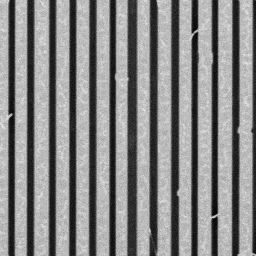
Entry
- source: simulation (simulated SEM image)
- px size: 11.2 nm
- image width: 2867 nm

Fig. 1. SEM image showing parallel lines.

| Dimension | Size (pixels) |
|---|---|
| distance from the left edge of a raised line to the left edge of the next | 20.4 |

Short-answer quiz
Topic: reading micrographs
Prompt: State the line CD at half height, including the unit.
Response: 146 nanometers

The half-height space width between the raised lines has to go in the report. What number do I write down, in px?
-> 6.88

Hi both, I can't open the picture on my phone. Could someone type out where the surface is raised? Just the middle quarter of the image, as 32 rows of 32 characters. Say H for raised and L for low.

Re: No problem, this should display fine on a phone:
HLLHHHLLHHHLLHHHLLHHHLLLHHHLLHHH
HLLHHHLLHHHLLHHHLLHHHLLLHHHLLHHH
HLLHHHLLHHHLLHHHLLHHHLLLHHHLLHHH
HLLHHHLLHHHLLHHHLLHHHLLLHHHLLHHH
HLLHHHLLHHHLLHHHLLHHHLLLHHHLLHHH
HLLHHHLLHHHLLHHHLLHHHLLLHHHLLHHH
HLLHHHLLHHHLLHHHLLHHHLLLHHHLLHHH
HLLHHHLLHHHLLHHHLLHHHLLLHHHLLHHH
HLLHHHLLHHHLLHHHLLHHHLLLHHHLLHHH
HLLHHHLLHHHLLHHHLLHHHLLLHHHLLHHH
HLLHHHLLHHHLLHHHLLHHHLLLHHHLLHHH
HLLHHHLLHHHLLHHHLLHHHLLLHHHLLHHH
HLLHHHLLHHHLLHHHLLHHHLLLHHHLLHHH
HLLHHHLLHHHLLHHHLLHHHLLLHHHLLHHH
HLLHHHLLHHHLLHHHLLHHHLLLHHHLLHHH
HLLHHHLLHHHLLHHHLLHHHLLLHHHLLHHH
HLLHHHLLHHHLLHHHLLHHHLLLHHHLLHHH
HLLHHHLLHHHLLHHHLLHHHLLLHHHLLHHH
HLLHHHLLHHHLLHHHLLHHHLLLHHHLLHHH
HLLHHHLLHHHLLHHHLLHHHLLLHHHLLHHH
HLLHHHLLHHHLLHHHLLHHHLLLHHHLLHHH
HLLHHHLLHHHLLHHHLLHHHLLLHHHLLHHH
HLLHHHLLHHHLLHHHLLHHHLLLHHHLLHHH
HLLHHHLLHHHLLHHHLLHHHLLLHHHLLHHH
HLLHHHLLHHHLLHHHLLHHHLLLHHHLLHHH
HLLHHHLLHHHLLHHHLLHHHLLLHHHLLHHH
HLLHHHLLHHHLLHHHLLHHHLLLHHHLLHHH
HLLHHHLLHHHLLHHHLLHHHLLLHHHLLHHH
HLLHHHLLHHHLLHHHLLHHHLLLHHHLLHHH
HLLHHHLLHHHLLHHHLLHHHLLLHHHLLHHH
HLLHHHLLHHHLLHHHLLHHHLLLHHHLLHHH
HLLHHHLLHHHLLHHHLLHHHLLLHHHLLHHH